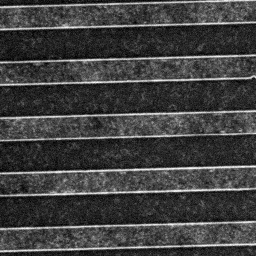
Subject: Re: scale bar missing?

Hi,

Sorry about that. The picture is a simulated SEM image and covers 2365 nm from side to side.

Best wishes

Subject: parallel lines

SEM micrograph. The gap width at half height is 0.304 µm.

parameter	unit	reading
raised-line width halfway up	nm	210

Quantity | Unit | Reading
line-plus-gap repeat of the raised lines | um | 0.512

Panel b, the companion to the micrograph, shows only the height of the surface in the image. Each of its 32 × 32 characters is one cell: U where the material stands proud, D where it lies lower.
DDDDDDDDDDDDDDDDDUUUUUUUUUUUUUUU
UUUUUUUUUUUUUUUUUUUUUUUUUUUUUUUU
UUUUUUUUUUUUUUUUUUUUUUUUUUUUUUUU
UUUUDDDDDDDDDDDDDDDDDDDDDDDDDDDD
DDDDDDDDDDDDDDDDDDDDDDDDDDDDDDDD
DDDDDDDDDDDDDDDDDDDDDDDDDDDDDDDD
DDDDDDDDDDDDDDDDDDDDDDDDDDDDDDDD
DDDDDDDDDDDUUUUUUUUUUUUUUUUUUUUU
UUUUUUUUUUUUUUUUUUUUUUUUUUUUUUUU
UUUUUUUUUUUUUUUUUUUUUUUUUUUUUUUU
UUDDDDDDDDDDDDDDDDDDDDDDDDDDDDDD
DDDDDDDDDDDDDDDDDDDDDDDDDDDDDDDD
DDDDDDDDDDDDDDDDDDDDDDDDDDDDDDDD
DDDDDDDDDDDDDDDDDDDDDDDDDDDDDDDD
DDDDDDDDDUUUUUUUUUUUUUUUUUUUUUUU
UUUUUUUUUUUUUUUUUUUUUUUUUUUUUUUU
UUUUUUUUUUUUUUUUUUUUUUUUUUUUUUUU
DDDDDDDDDDDDDDDDDDDDDDDDDDDDDDDD
DDDDDDDDDDDDDDDDDDDDDDDDDDDDDDDD
DDDDDDDDDDDDDDDDDDDDDDDDDDDDDDDD
DDDDDDDDDDDDDDDDDDDDDDDDDDDDDDDD
DDDDDDDDUUUUUUUUUUUUUUUUUUUUUUUU
UUUUUUUUUUUUUUUUUUUUUUUUUUUUUUUU
UUUUUUUUUUUUUUUUUUUUUUUUUUUUUUUU
DDDDDDDDDDDDDDDDDDDDDDDDDDDDDDDD
DDDDDDDDDDDDDDDDDDDDDDDDDDDDDDDD
DDDDDDDDDDDDDDDDDDDDDDDDDDDDDDDD
DDDDDDDDDDDDDDDDDDDDDDDDDDDDDDDD
DDDDDDUUUUUUUUUUUUUUUUUUUUUUUUUU
UUUUUUUUUUUUUUUUUUUUUUUUUUUUUUUU
UUUUUUUUUUUUUUUUUUUUUUUUUUUUUUUU
DDDDDDDDDDDDDDDDDDDDDDDDDDDDDDDD